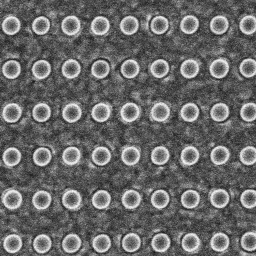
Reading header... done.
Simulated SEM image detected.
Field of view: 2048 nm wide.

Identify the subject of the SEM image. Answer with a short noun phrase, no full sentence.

a regular array of raised bodies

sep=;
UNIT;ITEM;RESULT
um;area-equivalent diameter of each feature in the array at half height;0.14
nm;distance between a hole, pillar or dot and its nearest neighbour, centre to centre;235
